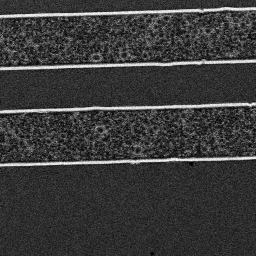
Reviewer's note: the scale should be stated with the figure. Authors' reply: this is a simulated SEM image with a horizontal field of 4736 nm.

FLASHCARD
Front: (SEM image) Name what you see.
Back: one or a few lines or trenches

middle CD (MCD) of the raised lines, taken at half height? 0.978 µm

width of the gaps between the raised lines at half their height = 795 nanometres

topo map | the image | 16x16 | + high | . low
................
++++++++++++++++
++++++++++++++++
++++++++++++++++
................
................
................
++++++++++++++++
++++++++++++++++
++++++++++++++++
................
................
................
................
................
................